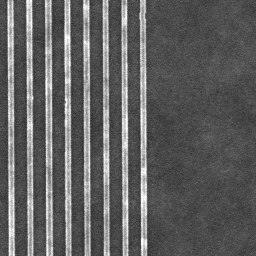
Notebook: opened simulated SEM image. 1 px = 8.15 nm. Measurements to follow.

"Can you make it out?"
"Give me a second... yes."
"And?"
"parallel lines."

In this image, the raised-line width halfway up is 0.0407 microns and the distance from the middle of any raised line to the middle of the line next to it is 154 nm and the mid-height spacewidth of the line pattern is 0.111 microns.